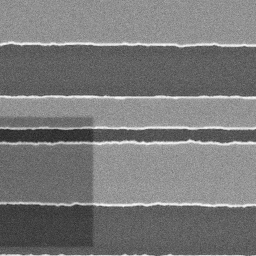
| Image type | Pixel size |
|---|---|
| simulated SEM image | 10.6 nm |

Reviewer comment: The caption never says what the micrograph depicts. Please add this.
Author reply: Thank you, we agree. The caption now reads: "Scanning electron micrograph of lines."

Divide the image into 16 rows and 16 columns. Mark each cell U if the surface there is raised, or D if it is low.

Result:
UUUUUUUUUUUUUUUU
UUUUUUUUUUUUUUUU
UUUUUUUUUUUUUUUU
DDDDDDDDDDDDDDDD
DDDDDDDDDDDDDDDD
DDDDDDDDDDDDDDDD
UUUUUUUUUUUUUUUU
UUUUUUUUUUUUUUUU
UUUUUUUUUUUUUUUU
UUUUUUUUUUUUUUUU
UUUUUUUUUUUUUUUU
UUUUUUUUUUUUUUUU
UUUUUUUUUUUUUUUU
DDDDDDDDDDDDDDDD
DDDDDDDDDDDDDDDD
DDDDDDDDDDDDDDDD